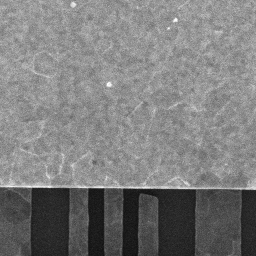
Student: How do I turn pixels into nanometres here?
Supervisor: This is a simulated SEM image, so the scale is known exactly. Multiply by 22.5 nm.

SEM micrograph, wiring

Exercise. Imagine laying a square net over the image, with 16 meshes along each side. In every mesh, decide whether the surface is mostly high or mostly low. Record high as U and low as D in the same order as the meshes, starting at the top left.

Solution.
UUUUUUUUUUUUUUUU
UUUUUUUUUUUUUUUU
UUUUUUUUUUUUUUUU
UUUUUUUUUUUUUUUU
UUUUUUUUUUUUUUUU
UUUUUUUUUUUUUUUU
UUUUUUUUUUUUUUUU
UUUUUUUUUUUUUUUU
UUUUUUUUUUUUUUUU
UUUUUUUUUUUUUUUU
UUUUUUUUUUUUUUUU
UUUUUUUUUUUUUUUU
DDDDDDDDDDDDDDDD
DDDDDDDDDDDDDDDD
DDDDDDDDDDDDDDDD
DDDDDDDDDDDDDDDD